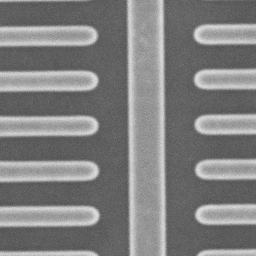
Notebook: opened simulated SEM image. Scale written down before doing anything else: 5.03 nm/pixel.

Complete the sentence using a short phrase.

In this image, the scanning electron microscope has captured groups of lines, slits or small figures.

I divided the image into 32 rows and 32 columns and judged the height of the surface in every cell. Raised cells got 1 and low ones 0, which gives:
00000000000000001111000000000000
00000000000000001111000000000000
00000000000000001111000000000000
11111111111000001111000001111111
11111111111100001111000011111111
11111111111000001111000000000000
00000000000000001111000000000000
00000000000000001111000000000000
00000000000000001111000000000000
11111111111100001111000001111111
11111111111100001111000001111111
00000000000000001111000000000000
00000000000000001111000000000000
00000000000000001111000000000000
00000000000000001111000000000111
11111111111100001111000001111111
11111111111100001111000001111111
00000000000000001111000000000000
00000000000000001111000000000000
00000000000000001111000000000000
11111111111100001111100001111111
11111111111100001111100001111111
11111111100000001111100000000000
00000000000000001111100000000000
00000000000000001111100000000000
00000000000000001111100000000000
11111111111100001111100001111111
11111111111100001111100001111111
00000000000000001111100000000000
00000000000000001111100000000000
00000000000000001111100000000000
00000000000000001111100001111111